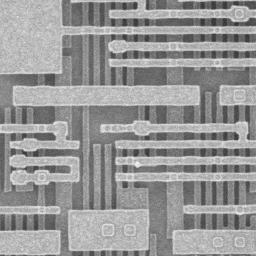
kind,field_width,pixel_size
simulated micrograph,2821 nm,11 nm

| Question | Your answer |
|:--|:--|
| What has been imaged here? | wiring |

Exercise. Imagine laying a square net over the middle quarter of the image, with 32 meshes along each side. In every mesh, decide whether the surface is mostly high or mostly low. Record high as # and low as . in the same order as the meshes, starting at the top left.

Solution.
............####################
................................
................................
................................
................................
.........................#######
################################
################################
################################
################################
................................
................................
................................
................................
..................###...........
#........#######################
#........#######################
#.................###...........
................................
####.........###################
####.........###################
................................
................................
###..........###################
####.........###################
..##..............#.............
..##............................
.###.........###.###############
####.........###################
................................
................................
................................